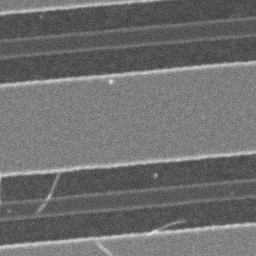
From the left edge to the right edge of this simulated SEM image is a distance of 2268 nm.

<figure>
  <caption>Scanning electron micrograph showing lines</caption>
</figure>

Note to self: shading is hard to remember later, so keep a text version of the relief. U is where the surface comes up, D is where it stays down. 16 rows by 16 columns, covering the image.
UUUUDDDDDDDDDDDD
DDDDDDDDDDDDDDDD
DDDDDDDDDDDDDDDD
DDDDDDDDDDDDDDDD
DDDDDDDDDUUUUUUU
UUUUUUUUUUUUUUUU
UUUUUUUUUUUUUUUU
UUUUUUUUUUUUUUUU
UUUUUUUUUUUUUUUU
UUUUUUUUUUUUUUUU
UUUUUUDDDDDDDDDD
DDDDDDDDDDDDDDDD
DDDDDDDDDDDDDDDD
DDDDDDDDDDDDDDDD
DDDDDDDDDDUUUUUU
UUUUUUUUUUUUUUUU